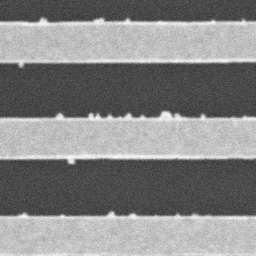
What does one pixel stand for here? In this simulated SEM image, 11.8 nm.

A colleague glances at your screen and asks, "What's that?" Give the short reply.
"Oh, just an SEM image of lines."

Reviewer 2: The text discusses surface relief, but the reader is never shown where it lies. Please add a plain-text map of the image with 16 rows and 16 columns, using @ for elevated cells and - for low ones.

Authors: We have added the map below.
----------------
@@-@@@@@@@@@@@@@
@@@@@@@@@@@@@@@@
@@@@@@@@@@@@@@@@
----------------
----------------
----------------
@@@@@@@@@@@@@@@@
@@@@@@@@@@@@@@@@
@@@@@@@@@@@@@@@@
----------------
----------------
----------------
----------------
@@@@@@@@@@@@@@@@
@@@@@@@@@@@@@@@@